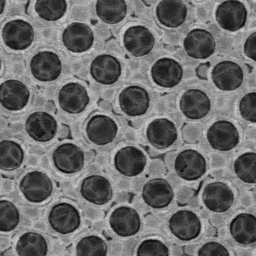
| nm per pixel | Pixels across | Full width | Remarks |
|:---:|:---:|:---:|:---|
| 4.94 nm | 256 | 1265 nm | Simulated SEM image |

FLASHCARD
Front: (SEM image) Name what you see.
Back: a regular array of holes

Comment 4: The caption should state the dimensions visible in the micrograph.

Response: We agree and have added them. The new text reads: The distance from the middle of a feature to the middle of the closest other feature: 207 nm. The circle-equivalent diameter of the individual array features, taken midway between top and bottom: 150 nanometres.